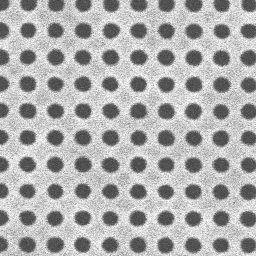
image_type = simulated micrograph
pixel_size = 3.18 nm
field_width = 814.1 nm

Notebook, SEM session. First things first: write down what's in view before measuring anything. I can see a regular array of holes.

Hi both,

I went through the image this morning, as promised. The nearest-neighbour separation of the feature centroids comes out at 26.6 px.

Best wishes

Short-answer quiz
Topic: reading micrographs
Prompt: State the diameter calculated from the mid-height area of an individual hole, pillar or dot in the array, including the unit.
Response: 52.6 nm